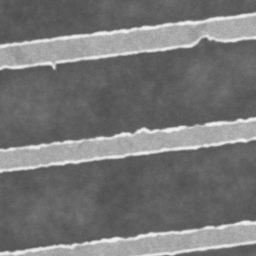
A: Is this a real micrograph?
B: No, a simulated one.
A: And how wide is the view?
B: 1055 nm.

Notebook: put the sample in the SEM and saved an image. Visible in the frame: one or a few lines or trenches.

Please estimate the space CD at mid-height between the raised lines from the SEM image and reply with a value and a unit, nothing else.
0.337 um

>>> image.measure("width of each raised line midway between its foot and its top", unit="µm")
0.0864